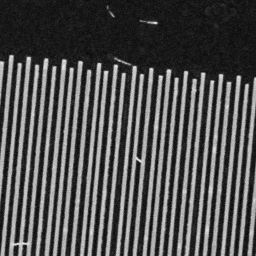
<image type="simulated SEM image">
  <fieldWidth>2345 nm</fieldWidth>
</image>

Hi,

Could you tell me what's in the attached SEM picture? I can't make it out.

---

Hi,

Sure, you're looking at parallel lines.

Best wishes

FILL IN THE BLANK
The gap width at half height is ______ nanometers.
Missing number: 47.9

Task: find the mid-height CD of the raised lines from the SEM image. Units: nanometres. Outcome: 31.9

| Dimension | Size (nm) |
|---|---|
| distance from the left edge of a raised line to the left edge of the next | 80.5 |